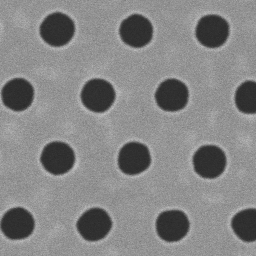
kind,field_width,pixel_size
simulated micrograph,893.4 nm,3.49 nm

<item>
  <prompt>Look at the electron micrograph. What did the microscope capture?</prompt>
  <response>a regular array of holes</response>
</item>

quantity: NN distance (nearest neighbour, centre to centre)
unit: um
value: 0.258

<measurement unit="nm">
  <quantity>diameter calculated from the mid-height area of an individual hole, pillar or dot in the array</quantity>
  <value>120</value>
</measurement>